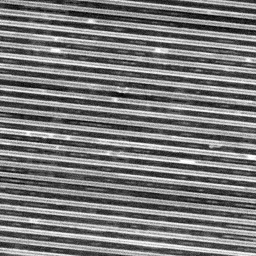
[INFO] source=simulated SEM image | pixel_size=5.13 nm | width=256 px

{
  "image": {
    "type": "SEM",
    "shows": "parallel lines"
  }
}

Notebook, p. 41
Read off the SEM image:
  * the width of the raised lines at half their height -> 0.0223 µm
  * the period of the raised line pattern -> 0.0554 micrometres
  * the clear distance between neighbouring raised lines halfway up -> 35.7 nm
